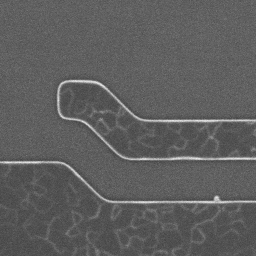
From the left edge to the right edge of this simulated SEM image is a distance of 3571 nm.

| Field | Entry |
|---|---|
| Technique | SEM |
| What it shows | groups of lines, slits or small figures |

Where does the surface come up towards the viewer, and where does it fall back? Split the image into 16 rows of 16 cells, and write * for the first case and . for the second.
................
................
................
................
................
....***.........
....****........
.....****.......
......**********
.......*********
****............
*****...........
*******.........
****************
****************
****************